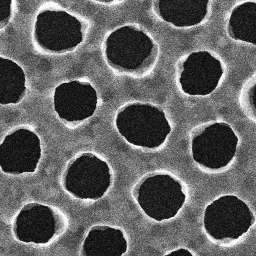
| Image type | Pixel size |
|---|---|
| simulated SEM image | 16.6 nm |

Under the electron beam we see a regular array of holes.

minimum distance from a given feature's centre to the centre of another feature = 1200 nanometers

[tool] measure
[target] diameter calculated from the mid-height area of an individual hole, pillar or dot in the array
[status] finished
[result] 760 nm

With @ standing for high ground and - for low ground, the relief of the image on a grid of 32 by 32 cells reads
-@@@@@@@@@@@@@@@@@@-------@@@@--
-@@@@---@@@@@@@@@@@@------@@@---
-@@@@-----@@@@@@@@@@-----@@@@---
@@@@------@@@@@--@@@@@@@@@@@----
@@@@------@@@@----@@@@@@@@@@@---
@@@@@-----@@@------@@@@@@@@@@@@-
@@@@@@@@@@@@@-------@@@@--@@@@@@
-@@@@@@@@@@@@------@@@@----@@@@@
---@@@@@@@@@@@----@@@@@-----@@@@
---@@@@@@@@@@@@@@@@@@@@-----@@@@
---@@@@@---@@@@@@@@@@@@----@@@@@
---@@@@-----@@@@@@@@@@@---@@@@@-
---@@@@-----@@@@@@@@@@@@@@@@@@@-
@@@@@@@-----@@@-----@@@@@@@@@@@-
@@@@@@@----@@@@------@@@@@@@@@@@
@@@@@@@@@@@@@@@------@@@@@@-@@@@
@@--@@@@@@@@@@@------@@@@----@@@
-----@@@@@@@@@@@-----@@@------@@
-----@@@@@@@@@@@@@@@@@@@------@@
-----@@@@@--@@@@@@@@@@@@-----@@@
-----@@@@----@@@@@@@@@@@@---@@@@
@---@@@@------@@@@@@@@@@@@@@@@@@
@@@@@@@@------@@@@----@@@@@@@@@@
@@@@@@@@-----@@@@------@@@@@@@@@
@@@@@@@@@----@@@@------@@@@@-@@@
@@@--@@@@@@@@@@@@------@@@-----@
@@-----@@@@@@@@@@@----@@@@-----@
@@-----@@@@@@@@@@@@-@@@@@@------
@@-----@@@@---@@@@@@@@@@@@-----@
@@-----@@@@----@@@@@@@@@@@----@@
@@@@@@@@@@------@@@@@@@@@@@@@@@@
@@@@@@@@@@------@@@@@@--@@@@@@@@